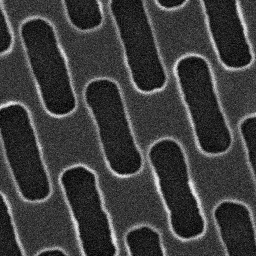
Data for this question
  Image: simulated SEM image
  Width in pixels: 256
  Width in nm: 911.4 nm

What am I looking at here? holes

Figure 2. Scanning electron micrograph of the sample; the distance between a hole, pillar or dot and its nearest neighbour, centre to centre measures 0.313 um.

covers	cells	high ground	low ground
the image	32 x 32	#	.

########....##....##...###....##
########.....#....########....##
.###.####....#.....#######....##
.##....###..###....#######....##
.##....########....########....#
.##....########....########....#
.##.....########....#######....#
####....########....###..###...#
####....########....##....######
####.....########....#....######
#####....##...###....##....#####
#####....##....########....#####
#####....##....########....#####
...###...##.....########....####
....########....########....####
....########....########....##..
....########....########.....#..
.....########....###..###....##.
#....########....##....##....##.
#....########.....#....########.
#....#########....#....########.
#.....##...###...##....#########
##....##....########....########
##....##....########....########
###...##.....#######....########
.########....########....###..##
.########....########....##....#
.########.....#######....##....#
..########....###..###...##.....
..########....##....##...###....
..########....##....########....
...##...###...##....########....